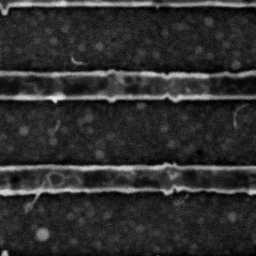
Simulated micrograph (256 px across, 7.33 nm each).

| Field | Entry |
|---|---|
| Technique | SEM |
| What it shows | one or a few lines or trenches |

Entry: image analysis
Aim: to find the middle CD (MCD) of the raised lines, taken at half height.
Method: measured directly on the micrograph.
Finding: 175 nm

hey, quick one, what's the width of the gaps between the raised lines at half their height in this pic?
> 0.508 micrometres